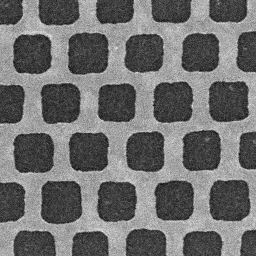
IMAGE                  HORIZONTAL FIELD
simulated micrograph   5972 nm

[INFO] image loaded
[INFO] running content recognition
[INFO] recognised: a regular array of holes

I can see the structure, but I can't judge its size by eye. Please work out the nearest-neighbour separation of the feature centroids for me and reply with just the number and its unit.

1.3 microns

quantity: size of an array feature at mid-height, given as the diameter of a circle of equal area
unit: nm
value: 1010